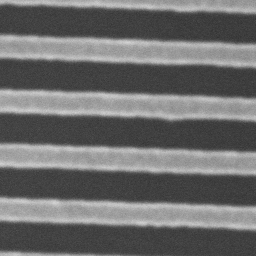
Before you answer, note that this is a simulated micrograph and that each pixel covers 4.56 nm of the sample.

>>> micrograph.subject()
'lines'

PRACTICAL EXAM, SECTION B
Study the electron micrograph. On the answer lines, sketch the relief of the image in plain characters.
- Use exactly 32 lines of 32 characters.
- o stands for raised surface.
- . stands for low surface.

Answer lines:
..oooooooooooooooooooooooooooooo
..............................oo
................................
................................
................................
oooooooooooooooooooooooooooo....
oooooooooooooooooooooooooooooooo
...........ooooooooooooooooooooo
................................
................................
................................
oooooo..........................
oooooooooooooooooooooooooooooooo
oooooooooooooooooooooooooooooooo
..................oooooooooooooo
................................
................................
................................
oooooooooooooo..................
oooooooooooooooooooooooooooooooo
oooooooooooooooooooooooooooooooo
.....................ooooooooooo
................................
................................
................................
oooooooooooooooo................
oooooooooooooooooooooooooooooooo
.ooooooooooooooooooooooooooooooo
.............................ooo
................................
................................
................................